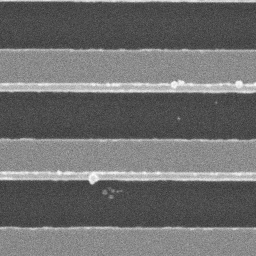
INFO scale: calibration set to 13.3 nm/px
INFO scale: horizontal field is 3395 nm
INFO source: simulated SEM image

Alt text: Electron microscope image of lines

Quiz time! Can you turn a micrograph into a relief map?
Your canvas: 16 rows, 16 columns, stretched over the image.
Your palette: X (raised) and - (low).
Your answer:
----------------
----------------
----------------
XXXXXXXXXXXXXXXX
XXXXXXXXXXXXXXXX
XXXXXXXXXXXXXXXX
----------------
----------------
----------------
XXXXXXXXXXXXXXXX
XXXXXXXXXXXXXXXX
----------------
----------------
----------------
XXXXXXXXXXXXXXXX
XXXXXXXXXXXXXXXX